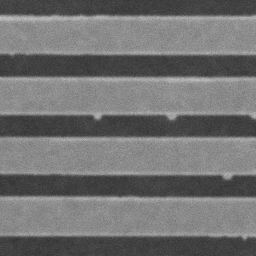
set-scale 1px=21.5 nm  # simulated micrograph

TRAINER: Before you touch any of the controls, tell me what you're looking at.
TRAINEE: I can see lines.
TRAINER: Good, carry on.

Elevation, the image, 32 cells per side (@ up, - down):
--------------------------------
--------------------------------
@@@@@@@@@@@@@@@@@@@@@@@@@@@@@@@@
@@@@@@@@@@@@@@@@@@@@@@@@@@@@@@@@
@@@@@@@@@@@@@@@@@@@@@@@@@@@@@@@@
@@@@@@@@@@@@@@@@@@@@@@@@@@@@@@@@
@@@@@@@@@@@@@@@@@@@@@@@@@@@@@@@@
--------------------------------
--------------------------------
--------------------------------
@@@@@@@@@@@@@@@@@@@@@@@@@@@@@@@@
@@@@@@@@@@@@@@@@@@@@@@@@@@@@@@@@
@@@@@@@@@@@@@@@@@@@@@@@@@@@@@@@@
@@@@@@@@@@@@@@@@@@@@@@@@@@@@@@@@
--------------------------------
--------------------------------
--------------------------------
@@@@@@@@@@@@@@@@@@@@@@@@@@@@@@@@
@@@@@@@@@@@@@@@@@@@@@@@@@@@@@@@@
@@@@@@@@@@@@@@@@@@@@@@@@@@@@@@@@
@@@@@@@@@@@@@@@@@@@@@@@@@@@@@@@@
@@@@@@@@@@@@@@@@@@@@@@@@@@@@@@@@
--------------------------------
--------------------------------
--------------------------------
@@@@@@@@@@@@@@@@@@@@@@@@@@@@@@@@
@@@@@@@@@@@@@@@@@@@@@@@@@@@@@@@@
@@@@@@@@@@@@@@@@@@@@@@@@@@@@@@@@
@@@@@@@@@@@@@@@@@@@@@@@@@@@@@@@@
---------------------------@----
--------------------------------
--------------------------------